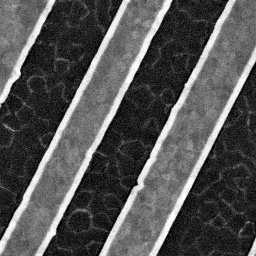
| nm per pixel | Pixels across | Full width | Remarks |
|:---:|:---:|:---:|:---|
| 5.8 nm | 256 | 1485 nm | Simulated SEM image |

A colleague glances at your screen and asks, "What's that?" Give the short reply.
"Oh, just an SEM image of one or a few lines or trenches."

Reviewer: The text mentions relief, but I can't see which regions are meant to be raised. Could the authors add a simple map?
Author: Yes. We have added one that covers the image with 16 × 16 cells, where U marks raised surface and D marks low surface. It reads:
UUUDDDDDUUDDDDUU
UUDDDDDUUUDDDDUU
UUDDDDDUUDDDDUUU
UDDDDDUUUDDDDUUU
UDDDDDUUDDDDUUUD
DDDDDUUUDDDDUUUD
DDDDDUUDDDDUUUDD
DDDDUUUDDDDUUUDD
DDDDUUDDDDUUUDDD
DDDUUUDDDDUUUDDD
DDDUUDDDDUUUDDDD
DDUUUDDDDUUUDDDD
DDUUDDDDUUUDDDDD
DUUUDDDDUUUDDDDD
DUUDDDDUUUDDDDDD
UUUDDDDUUUDDDDDD